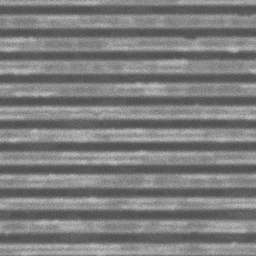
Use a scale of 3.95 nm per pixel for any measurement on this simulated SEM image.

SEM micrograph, parallel lines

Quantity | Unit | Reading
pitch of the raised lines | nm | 90.2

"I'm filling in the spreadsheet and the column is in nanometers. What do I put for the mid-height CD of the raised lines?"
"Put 42.5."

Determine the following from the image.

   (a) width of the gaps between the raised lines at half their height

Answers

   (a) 46.4 nm